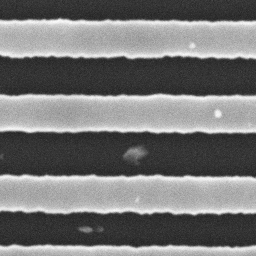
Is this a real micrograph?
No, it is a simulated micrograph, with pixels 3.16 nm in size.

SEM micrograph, lines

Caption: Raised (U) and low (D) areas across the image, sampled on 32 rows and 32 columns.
DDDDDDDDDDDDDDDDDDDDDDDDDDDDDDDD
DDDDDDDDDDDDDDDDDDDDDDDDDDDDDDDD
DDDDDDDUUDDDDDDDDDDDDDDDDDDDDDDD
UUUUUUUUUUUUUUUUUUUUUUUUUUUUUUUU
UUUUUUUUUUUUUUUUUUUUUUUUUUUUUUUU
UUUUUUUUUUUUUUUUUUUUUUUUUUUUUUUU
UUUUUUUUUUUUUUUUUUUUUUUUUUUUUUUU
DDDDDDDDDDDDDDDDDDDDDDDDDDDDDDDD
DDDDDDDDDDDDDDDDDDDDDDDDDDDDDDDD
DDDDDDDDDDDDDDDDDDDDDDDDDDDDDDDD
DDDDDDDDDDDDDDDDDDDDDDDDDDDDDDDD
DDDDDDDDDDDDDDDDDDDDDDDDDDDDDDDD
UUUUUUUUUUUUUUUUUUUUUUUUUUUUUUUU
UUUUUUUUUUUUUUUUUUUUUUUUUUUUUUUU
UUUUUUUUUUUUUUUUUUUUUUUUUUUUUUUU
UUUUUUUUUUUUUUUUUUUUUUUUUUUUUUUU
DDDUDDDUUUDDDDDUDDDUUUUUDUUUUUUU
DDDDDDDDDDDDDDDDDDDDDDDDDDDDDDDD
DDDDDDDDDDDDDDDDDDDDDDDDDDDDDDDD
DDDDDDDDDDDDDDDDDDDDDDDDDDDDDDDD
DDDDDDDDDDDDDDDDDDDDDDDDDDDDDDDD
DDDDDDDDDDDDDDDDDDDDDDDDDDDDDDDD
UUUUUUUUUUUUUUUUUUUUUUUUUUUUUUUU
UUUUUUUUUUUUUUUUUUUUUUUUUUUUUUUU
UUUUUUUUUUUUUUUUUUUUUUUUUUUUUUUU
UUUUUUUUUUUUUUUUUUUUUUUUUUUUUUUU
DDDUDUUUUUDUUUUUDUUUUUUUUUUUUUUU
DDDDDDDDDDDDDDDDDDDDDDDDDDDDDDDD
DDDDDDDDDDDDDDDDDDDDDDDDDDDDDDDD
DDDDDDDDDDDDDDDDDDDDDDDDDDDDDDDD
DDDDDDDDDDDDDDDDDDDDDDDDDDDDDDDD
UUUUUUUUUUUUUUUUUUUUUUUUUUUUUUUU